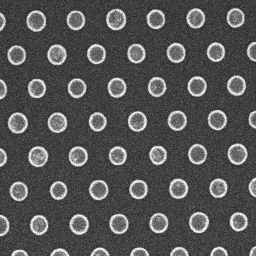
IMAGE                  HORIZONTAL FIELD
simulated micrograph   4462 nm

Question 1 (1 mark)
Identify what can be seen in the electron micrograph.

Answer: a regular array of raised bodies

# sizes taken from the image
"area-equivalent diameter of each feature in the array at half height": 308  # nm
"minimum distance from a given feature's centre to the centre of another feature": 682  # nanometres